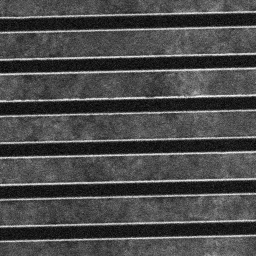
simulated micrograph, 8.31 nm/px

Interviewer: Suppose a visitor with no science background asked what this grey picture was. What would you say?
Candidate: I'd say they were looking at parallel lines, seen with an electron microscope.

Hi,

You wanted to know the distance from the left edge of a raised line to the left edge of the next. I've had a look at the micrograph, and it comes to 41.8 pixels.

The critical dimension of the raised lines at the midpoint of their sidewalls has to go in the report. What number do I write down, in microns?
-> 0.131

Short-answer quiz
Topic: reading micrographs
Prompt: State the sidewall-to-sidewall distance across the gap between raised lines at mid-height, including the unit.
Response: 220 nanometres